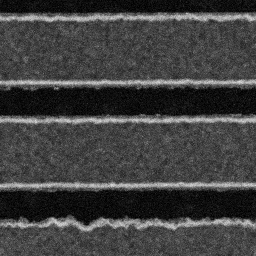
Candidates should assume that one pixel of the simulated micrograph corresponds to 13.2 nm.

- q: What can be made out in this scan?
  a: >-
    one or a few lines or trenches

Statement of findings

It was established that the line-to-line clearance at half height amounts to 497 nm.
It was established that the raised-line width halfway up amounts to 854 nm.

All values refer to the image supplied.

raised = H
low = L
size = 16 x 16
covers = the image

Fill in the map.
LLLLLLLLLLLLLLLL
HHHHHHHHHHHHHHHH
HHHHHHHHHHHHHHHH
HHHHHHHHHHHHHHHH
HHHHHHHHHHHHHHHH
LLLLLLLLLLLLLLLL
LLLLLLLLLLLLLLLL
HLLLLHLLLLLLHLLL
HHHHHHHHHHHHHHHH
HHHHHHHHHHHHHHHH
HHHHHHHHHHHHHHHH
HHHHHHHHHHHHHHHH
LLLLLLLLLLLLLLLL
LLLLLLLLLLLLLLLL
HHHHHHHHHHHHHHHH
HHHHHHHHHHHHHHHH